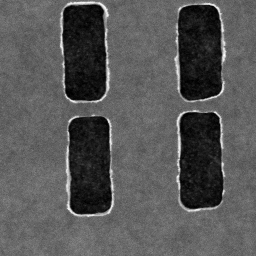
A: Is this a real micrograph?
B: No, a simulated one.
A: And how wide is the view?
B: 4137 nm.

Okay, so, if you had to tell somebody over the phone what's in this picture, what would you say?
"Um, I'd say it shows holes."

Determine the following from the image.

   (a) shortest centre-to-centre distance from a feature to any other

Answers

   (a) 1770 nm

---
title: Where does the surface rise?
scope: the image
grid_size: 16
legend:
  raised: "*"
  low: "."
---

****..******.***
****...****...**
****...****...**
****...****...**
****...****...**
****...****...**
****************
*****..****...**
****...****...**
****...****...**
****...****...**
****...****...**
****...****...**
****************
****************
****************